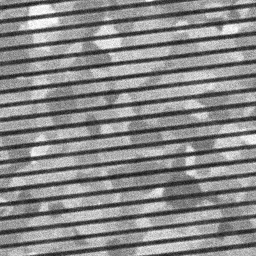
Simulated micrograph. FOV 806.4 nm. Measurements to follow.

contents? parallel lines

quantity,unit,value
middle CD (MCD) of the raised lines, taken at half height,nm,26.2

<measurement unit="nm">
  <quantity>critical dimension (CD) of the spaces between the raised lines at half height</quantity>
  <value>17.2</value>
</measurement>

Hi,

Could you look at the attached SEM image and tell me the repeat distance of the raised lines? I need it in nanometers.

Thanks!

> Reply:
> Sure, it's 44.